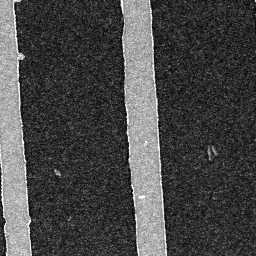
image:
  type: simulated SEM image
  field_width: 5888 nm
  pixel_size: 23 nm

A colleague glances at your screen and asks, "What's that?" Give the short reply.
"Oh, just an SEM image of one or a few lines or trenches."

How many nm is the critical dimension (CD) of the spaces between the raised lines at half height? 2450